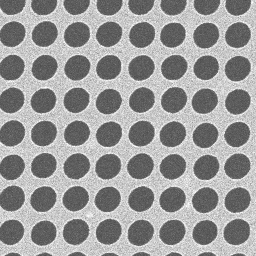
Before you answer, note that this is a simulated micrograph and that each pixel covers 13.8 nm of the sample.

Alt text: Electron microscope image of a regular array of holes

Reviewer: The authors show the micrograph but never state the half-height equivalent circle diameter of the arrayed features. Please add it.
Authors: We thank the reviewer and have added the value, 359 nm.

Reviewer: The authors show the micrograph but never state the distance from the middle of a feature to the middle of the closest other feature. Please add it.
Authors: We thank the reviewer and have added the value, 439 nm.